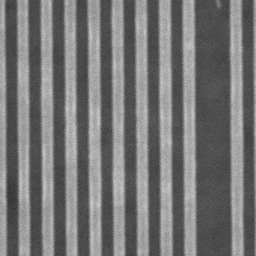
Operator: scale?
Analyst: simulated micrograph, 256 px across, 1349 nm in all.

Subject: wiring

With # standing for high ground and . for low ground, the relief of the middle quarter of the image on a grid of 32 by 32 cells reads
.##...###....##...###...##....##
.##...###....##...###...##....##
.##...###...###...###...###...##
.##...###...###...###...###...##
.##...###...###...###...###...##
.##...###...###...###...###...##
.##...###...###...###...###...##
.##...###...###...###...###...##
.##...###...###...###...###...##
.##...###....##...###...###...##
.##....##....##...###...###...##
.##....##....##...###...###...##
.##....##....##...###...###...##
.##....##....##...###...###...##
.##....##....##...###...###...##
.##....##....##...###...###...##
.##....##....##...###...###...##
.##....##....#....###...###...##
.##....##....#....###...###...##
.##....##....#....###...###...##
.##....##....#....###...###...##
.##....##....##...###...###...##
.##....##....##...###...###...##
.##...###....##...###...###...##
.##...###....##...###...###...##
.##...###....##...###...###...##
.##...###....##...###...###...##
.##...###....##...###...###...##
.##....##....##...###...###...##
.##....##....##....##...###...##
.##....##....##....##...###...##
.##....##....##....##...###...##